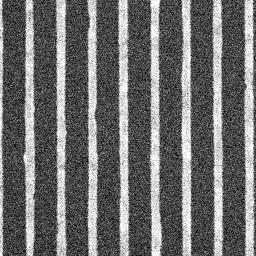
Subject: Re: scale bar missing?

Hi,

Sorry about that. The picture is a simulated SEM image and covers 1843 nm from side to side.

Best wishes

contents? parallel lines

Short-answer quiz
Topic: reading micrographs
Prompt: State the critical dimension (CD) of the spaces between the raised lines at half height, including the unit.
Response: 175 nm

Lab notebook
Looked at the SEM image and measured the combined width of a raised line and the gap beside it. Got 226 nanometres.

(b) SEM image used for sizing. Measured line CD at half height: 7 px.